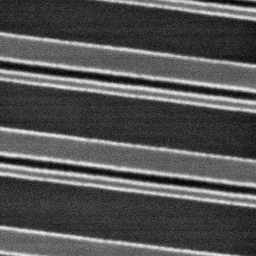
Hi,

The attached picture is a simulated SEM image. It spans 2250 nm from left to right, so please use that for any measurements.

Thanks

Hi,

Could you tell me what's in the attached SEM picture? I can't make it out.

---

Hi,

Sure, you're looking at lines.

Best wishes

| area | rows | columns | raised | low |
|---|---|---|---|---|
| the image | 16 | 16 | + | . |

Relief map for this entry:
...........+++++
................
+++.............
+++++++++++.....
++++++++++++++++
....++++++++++++
............++++
................
++++............
++++++++++++....
++++++++++++++++
.....+++++++++++
.............+++
................
+++.............
++++++++++......